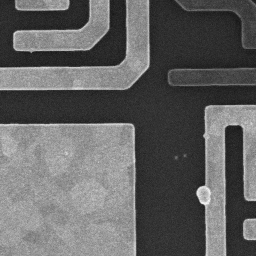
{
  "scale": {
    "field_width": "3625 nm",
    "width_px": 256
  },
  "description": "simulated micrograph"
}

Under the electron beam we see wiring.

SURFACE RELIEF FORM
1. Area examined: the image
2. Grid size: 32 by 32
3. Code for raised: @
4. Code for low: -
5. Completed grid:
--@@@@@@@--@@@--@@@---@@@@@@@@@@
-----------@@@--@@@----------@@@
-----------@@@--@@@-----------@@
----------@@@@--@@@-----------@@
--@@@@@@@@@@@---@@@-----------@@
--@@@@@@@@@@----@@@-----------@@
----------------@@@-------------
----------------@@@-------------
@@@@@@@@@@@@@@@@@@--------------
@@@@@@@@@@@@@@@@@----@@@@@@@@@@@
@@@@@@@@@@@@@@@@@----@@@@@@@@@@@
--------------------------------
--------------------------------
--------------------------@@@@@@
--------------------------@@@@@@
--------------------------@@@@@@
@@@@@@@@@@@@@@@@@---------@@--@@
@@@@@@@@@@@@@@@@@---------@@--@@
@@@@@@@@@@@@@@@@@---------@@--@@
@@@@@@@@@@@@@@@@@---------@@--@@
@@@@@@@@@@@@@@@@@---------@@--@@
@@@@@@@@@@@@@@@@@---------@@---@
@@@@@@@@@@@@@@@@@---------@@---@
@@@@@@@@@@@@@@@@@--------@@@---@
@@@@@@@@@@@@@@@@@--------@@@---@
@@@@@@@@@@@@@@@@@--------@@@----
@@@@@@@@@@@@@@@@@---------@@----
@@@@@@@@@@@@@@@@@---------@@---@
@@@@@@@@@@@@@@@@@---------@@--@@
@@@@@@@@@@@@@@@@@---------@@---@
@@@@@@@@@@@@@@@@@---------@@----
@@@@@@@@@@@@@@@@@---------@@----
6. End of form